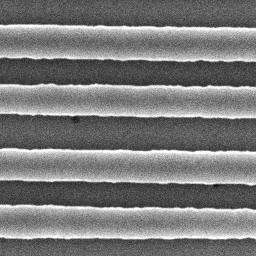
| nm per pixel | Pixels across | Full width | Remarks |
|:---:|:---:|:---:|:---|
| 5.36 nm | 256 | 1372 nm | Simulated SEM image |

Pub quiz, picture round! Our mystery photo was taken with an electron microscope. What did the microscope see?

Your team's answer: lines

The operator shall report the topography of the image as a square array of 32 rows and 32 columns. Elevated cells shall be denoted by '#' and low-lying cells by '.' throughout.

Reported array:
................................
................................
................................
##############################..
################################
################################
################################
...............#..##############
................................
................................
................................
################################
################################
################################
.................###############
................................
................................
................................
................................
################################
################################
################################
...#############################
................................
................................
................................
################################
################################
################################
################################
................................
................................